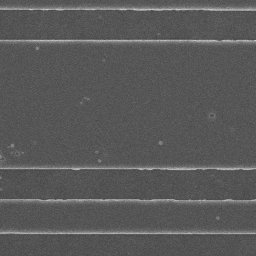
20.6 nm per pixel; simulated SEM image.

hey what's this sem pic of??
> lines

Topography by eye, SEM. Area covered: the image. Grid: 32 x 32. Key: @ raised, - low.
@@@@@@@@@@@@@@@@@@@@@@@@@@@@@@@@
--------------------------------
--------------------------------
--------------------------------
--------------------------------
@@@@@@@@@@@@@@@@@@@@@@@@@@@@@@@@
@@@@@@@@@@@@@@@@@@@@@@@@@@@@@@@@
@@@@@@@@@@@@@@@@@@@@@@@@@@@@@@@@
@@@@@@@@@@@@@@@@@@@@@@@@@@@@@@@@
@@@@@@@@@@@@@@@@@@@@@@@@@@@@@@@@
@@@@@@@@@@@@@@@@@@@@@@@@@@@@@@@@
@@@@@@@@@@@@@@@@@@@@@@@@@@@@@@@@
@@@@@@@@@@@@@@@@@@@@@@@@@@@@@@@@
@@@@@@@@@@@@@@@@@@@@@@@@@@@@@@@@
@@@@@@@@@@@@@@@@@@@@@@@@@@@@@@@@
@@@@@@@@@@@@@@@@@@@@@@@@@@@@@@@@
@@@@@@@@@@@@@@@@@@@@@@@@@@@@@@@@
@@@@@@@@@@@@@@@@@@@@@@@@@@@@@@@@
@@@@@@@@@@@@@@@@@@@@@@@@@@@@@@@@
@@@@@@@@@@@@@@@@@@@@@@@@@@@@@@@@
@@@@@@@@@@@@@@@@@@@@@@@@@@@@@@@@
--------------------------------
--------------------------------
--------------------------------
--------------------------------
@@@@@@@@@@@@@@@@@@@@@@@@@@@@@@@@
@@@@@@@@@@@@@@@@@@@@@@@@@@@@@@@@
@@@@@@@@@@@@@@@@@@@@@@@@@@@@@@@@
@@@@@@@@@@@@@@@@@@@@@@@@@@@@@@@@
--------------------------------
--------------------------------
--------------------------------